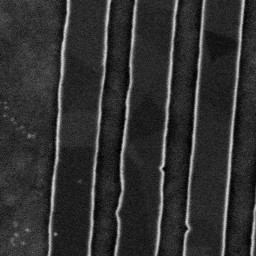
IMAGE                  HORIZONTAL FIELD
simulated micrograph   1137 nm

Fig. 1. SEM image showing one or a few lines or trenches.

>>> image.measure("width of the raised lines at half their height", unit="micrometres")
0.181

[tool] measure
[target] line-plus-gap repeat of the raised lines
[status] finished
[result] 299 nm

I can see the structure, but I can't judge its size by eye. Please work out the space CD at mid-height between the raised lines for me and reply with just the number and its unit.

26.3 px